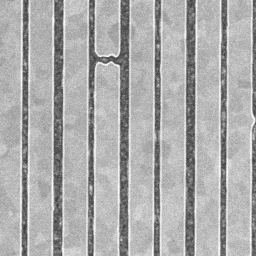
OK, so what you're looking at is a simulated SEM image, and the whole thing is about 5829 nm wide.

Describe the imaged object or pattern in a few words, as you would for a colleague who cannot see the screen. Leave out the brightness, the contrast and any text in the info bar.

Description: parallel lines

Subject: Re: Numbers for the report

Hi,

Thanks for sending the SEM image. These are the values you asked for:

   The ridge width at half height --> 549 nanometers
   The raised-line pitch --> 0.754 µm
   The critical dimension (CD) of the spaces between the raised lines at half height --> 168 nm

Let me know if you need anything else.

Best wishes